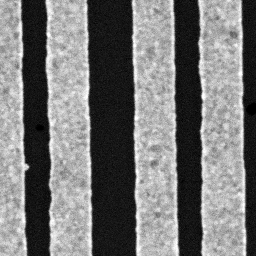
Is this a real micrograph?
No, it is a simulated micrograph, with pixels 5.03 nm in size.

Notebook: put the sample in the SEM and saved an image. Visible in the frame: lines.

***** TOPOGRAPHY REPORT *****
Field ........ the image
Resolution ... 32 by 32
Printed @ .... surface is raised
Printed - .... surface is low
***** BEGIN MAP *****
@@@---@@@@@------@@@@----@@@@@--
@@@---@@@@@------@@@@@---@@@@@--
@@@---@@@@@------@@@@@---@@@@@--
@@@---@@@@@------@@@@@---@@@@@--
@@@---@@@@@------@@@@@---@@@@@--
@@@---@@@@@------@@@@@---@@@@@--
@@@---@@@@@------@@@@@---@@@@@--
@@@---@@@@@------@@@@@---@@@@@--
@@@---@@@@@------@@@@@---@@@@@--
@@@---@@@@@------@@@@@---@@@@@--
@@@---@@@@@------@@@@@---@@@@@--
@@@---@@@@@------@@@@@---@@@@@--
@@@---@@@@@------@@@@@---@@@@@--
@@@---@@@@@------@@@@@---@@@@@--
@@@---@@@@@------@@@@@---@@@@@--
@@@---@@@@@------@@@@@---@@@@@--
@@@---@@@@@------@@@@@---@@@@@--
@@@---@@@@@------@@@@@---@@@@@--
@@@---@@@@@------@@@@@---@@@@@--
@@@---@@@@@------@@@@@---@@@@@--
@@@---@@@@@------@@@@@---@@@@@--
@@@---@@@@@------@@@@@---@@@@@@-
@@@---@@@@@------@@@@@---@@@@@@-
@@@---@@@@@------@@@@@---@@@@@@-
@@@---@@@@@------@@@@@---@@@@@@-
@@@---@@@@@------@@@@@---@@@@@@-
@@@---@@@@@------@@@@@---@@@@@@-
@@@---@@@@@------@@@@@---@@@@@@-
@@@---@@@@@------@@@@@---@@@@@@-
@@@---@@@@@------@@@@@---@@@@@@-
@@@---@@@@@------@@@@@---@@@@@@-
@@@---@@@@@------@@@@@---@@@@@@-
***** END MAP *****